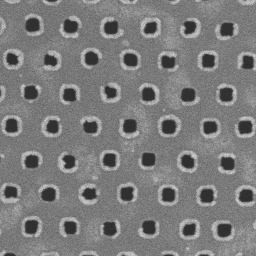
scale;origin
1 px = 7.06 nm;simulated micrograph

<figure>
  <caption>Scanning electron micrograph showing a regular array of holes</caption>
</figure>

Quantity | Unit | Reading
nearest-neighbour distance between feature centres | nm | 262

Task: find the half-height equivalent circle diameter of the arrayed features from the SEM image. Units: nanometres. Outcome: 98.9